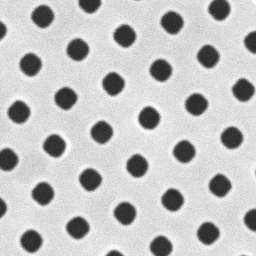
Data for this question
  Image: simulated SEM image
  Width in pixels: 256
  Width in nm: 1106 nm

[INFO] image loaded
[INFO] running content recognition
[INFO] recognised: a regular array of holes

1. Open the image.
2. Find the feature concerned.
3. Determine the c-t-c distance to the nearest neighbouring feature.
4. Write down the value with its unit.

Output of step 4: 211 nm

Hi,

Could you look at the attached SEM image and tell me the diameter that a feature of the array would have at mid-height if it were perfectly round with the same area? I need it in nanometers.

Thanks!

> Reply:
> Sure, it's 101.